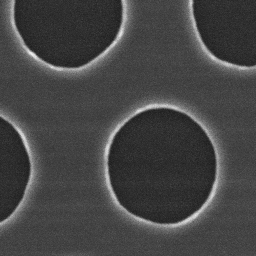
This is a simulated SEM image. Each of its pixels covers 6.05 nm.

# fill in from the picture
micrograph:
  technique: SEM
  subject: holes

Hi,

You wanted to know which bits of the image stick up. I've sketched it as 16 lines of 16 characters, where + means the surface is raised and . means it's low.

+.......++++....
+.......++++....
+......++++++...
++....+++++++...
++++++++++++++++
++++++++++++++++
++++++++++++++++
++++++++....++++
.++++++......+++
..+++++......+++
..+++++.......++
..+++++......+++
.++++++......+++
.++++++++...++++
++++++++++++++++
++++++++++++++++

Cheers